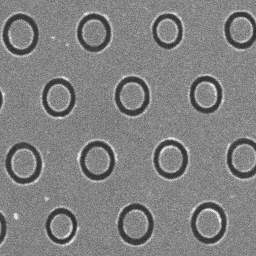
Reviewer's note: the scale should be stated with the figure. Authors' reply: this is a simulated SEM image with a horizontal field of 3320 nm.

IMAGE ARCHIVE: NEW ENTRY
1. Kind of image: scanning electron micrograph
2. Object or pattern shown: a regular array of ring-shaped grooves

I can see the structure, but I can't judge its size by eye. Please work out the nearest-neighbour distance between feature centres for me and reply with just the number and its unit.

954 nm